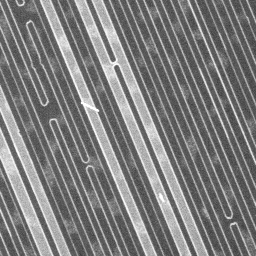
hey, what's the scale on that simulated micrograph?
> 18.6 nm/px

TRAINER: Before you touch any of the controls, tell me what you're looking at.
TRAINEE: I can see parallel lines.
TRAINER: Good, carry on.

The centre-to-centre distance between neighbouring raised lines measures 296 nm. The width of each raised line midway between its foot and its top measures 174 nm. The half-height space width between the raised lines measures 120 nm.